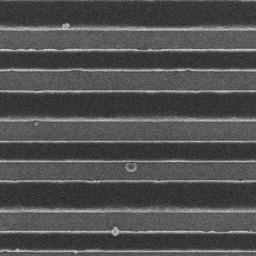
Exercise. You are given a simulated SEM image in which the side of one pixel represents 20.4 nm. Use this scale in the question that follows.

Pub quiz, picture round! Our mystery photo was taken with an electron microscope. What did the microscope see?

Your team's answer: lines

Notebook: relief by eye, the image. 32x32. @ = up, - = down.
@@@@@@@@@@@@@@@@@@@@@@@@@@@@@@@@
@@@@@@@@@@@@@@@@@@@@@@@@@@@@@@@@
@@@@@@@@@@@@@@@@@@@@@@@@@@@@@@@@
-@@@@@@@@----@@@@@@@@@@@@@@@@-@@
--------------------------------
--------------------------------
@@@@@@@@@@@@@@@@@@@@@@@@@@@@@@@@
@@@@@@@@@@@@@@@@@@@@@@@@@@@@@@@@
@@@@@@@@@@@@@@@@@@@@@@@@@@@@@@@@
--------------------------------
--------------------------------
@@@@@@@@@@@@@@@@@@@@@@@@@@@@@@@@
@@@@@@@@@@@@@@@@@@@@@@@@@@@@@@@@
@@@@@@@@@@@@@@@@@@@@@@@@@@@@@@@@
@@@@@@@@@@@@@@@@@@@@@@@@@@@@@@@@
--------------------------------
--------------------------------
--------------------------------
@@@@@@@@@@@@@@@@@@@@@@@@@@@@@@@@
@@@@@@@@@@@@@@@@@@@@@@@@@@@@@@@@
----------------@---------------
--------------------------------
--------------------------------
@@@@@@@@@@@@@@@@@@@@@@@@@@@@@@@@
@@@@@@@@@@@@@@@@@@@@@@@@@@@@@@@@
@@@@@@@@@@@@@@@@@@@@@@@@@@@@@@@@
--------------------------------
--------------------------------
--------------------------------
@@@@@@@@@@@@@@@@@@@@@@@@@@@@@@@@
@@@@@@@@@@@@@@@@@@@@@@@@@@@@@@@@
---------@----------------------